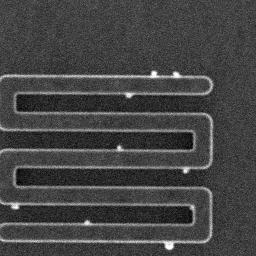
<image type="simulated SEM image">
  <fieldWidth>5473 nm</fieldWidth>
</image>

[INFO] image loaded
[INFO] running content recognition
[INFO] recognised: groups of lines, slits or small figures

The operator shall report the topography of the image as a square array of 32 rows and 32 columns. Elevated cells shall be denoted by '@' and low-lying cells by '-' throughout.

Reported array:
--------------------------------
--------------------------------
--------------------------------
--------------------------------
--------------------------------
--------------------------------
--------------------------------
--------------------------------
--------------------------------
@@@@@@@@@@@@@@@@@@--------------
@@@@@@@@@@@@@@@@@@@@@@@@@@@-----
@@@@@@@@@@@@@@@@@@@@@@@@@@------
@@------------------------------
@@------------------------------
@@@@@@@@@@@@@@@@@@@@@@@@@@------
@@@@@@@@@@@@@@@@@@@@@@@@@@@-----
------------------------@@@-----
------------------------@@------
------------------------@@------
@@@@@@@@@@@@@@@@@@@@@@@@@@------
@@@@@@@@@@@@@@@@@@@@@@@@@@------
@@------------------------------
@@------------------------------
@@@@@@@@@@@@@@@@@@@@@@@@@@------
@@@@@@@@@@@@@@@@@@@@@@@@@@------
--@@@@@@@@@@@@@@@@@@@@@@@@------
------------------------@@------
------------------------@@------
@@@@@@@@@@@@@@@@@@@@@@@@@@------
@@@@@@@@@@@@@@@@@@@@@@@@@@------
--------------------------------
--------------------------------